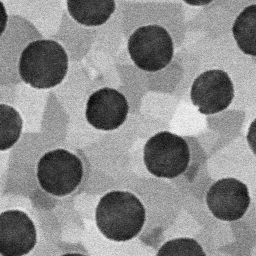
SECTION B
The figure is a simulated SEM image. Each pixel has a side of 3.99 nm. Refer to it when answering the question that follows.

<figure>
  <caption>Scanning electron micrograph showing a regular array of holes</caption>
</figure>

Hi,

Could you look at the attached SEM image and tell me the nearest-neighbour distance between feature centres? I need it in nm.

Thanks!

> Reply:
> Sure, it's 301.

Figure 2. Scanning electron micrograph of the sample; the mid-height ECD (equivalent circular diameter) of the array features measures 191 nm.